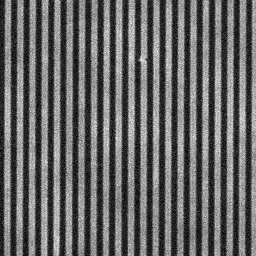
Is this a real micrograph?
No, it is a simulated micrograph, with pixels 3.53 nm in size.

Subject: parallel lines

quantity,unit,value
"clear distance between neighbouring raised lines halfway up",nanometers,25.1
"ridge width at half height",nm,19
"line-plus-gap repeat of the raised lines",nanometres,43.6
